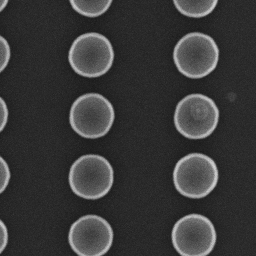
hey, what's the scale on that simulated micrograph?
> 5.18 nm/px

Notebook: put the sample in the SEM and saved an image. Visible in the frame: raised bodies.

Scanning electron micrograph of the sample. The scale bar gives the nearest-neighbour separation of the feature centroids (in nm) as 314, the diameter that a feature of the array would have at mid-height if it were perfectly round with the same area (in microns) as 0.219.